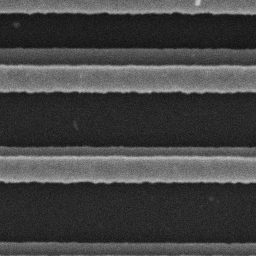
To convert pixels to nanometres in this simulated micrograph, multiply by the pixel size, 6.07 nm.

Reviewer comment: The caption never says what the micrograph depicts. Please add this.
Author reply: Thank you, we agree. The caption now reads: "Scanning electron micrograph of lines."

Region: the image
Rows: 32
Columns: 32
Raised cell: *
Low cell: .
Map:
********************************
********************************
................................
................................
................................
................................
********************************
********************************
********************************
********************************
********************************
...*........*....*.....*.*.*....
................................
................................
................................
................................
................................
................................
*************************.******
********************************
********************************
********************************
********************************
................................
................................
................................
................................
................................
................................
................................
********************************
********************************